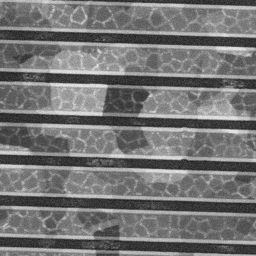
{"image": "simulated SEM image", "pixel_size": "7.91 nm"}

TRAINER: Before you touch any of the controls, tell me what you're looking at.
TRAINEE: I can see parallel lines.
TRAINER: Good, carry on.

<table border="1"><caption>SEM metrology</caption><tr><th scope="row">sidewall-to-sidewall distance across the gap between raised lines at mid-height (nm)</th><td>107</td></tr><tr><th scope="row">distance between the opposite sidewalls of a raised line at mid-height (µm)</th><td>0.221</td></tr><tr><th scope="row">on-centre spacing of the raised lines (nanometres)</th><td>328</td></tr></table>